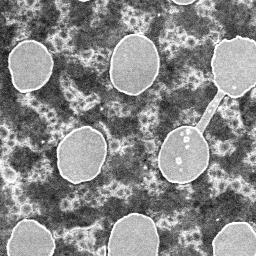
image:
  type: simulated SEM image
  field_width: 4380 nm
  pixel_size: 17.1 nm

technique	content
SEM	raised bodies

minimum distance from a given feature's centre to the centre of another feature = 1750 nm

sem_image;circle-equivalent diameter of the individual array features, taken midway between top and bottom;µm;0.897